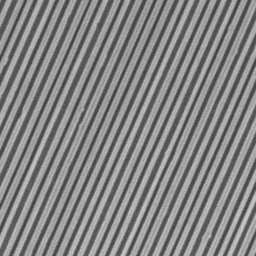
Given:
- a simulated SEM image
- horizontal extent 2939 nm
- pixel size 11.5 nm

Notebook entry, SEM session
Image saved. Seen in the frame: parallel lines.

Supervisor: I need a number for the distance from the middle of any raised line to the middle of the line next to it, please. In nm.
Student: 113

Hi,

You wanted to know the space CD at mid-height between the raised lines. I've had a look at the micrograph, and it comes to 53.9 nm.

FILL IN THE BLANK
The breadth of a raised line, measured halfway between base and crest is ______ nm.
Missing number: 55.2